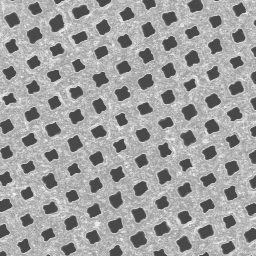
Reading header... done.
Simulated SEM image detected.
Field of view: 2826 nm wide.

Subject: a regular array of holes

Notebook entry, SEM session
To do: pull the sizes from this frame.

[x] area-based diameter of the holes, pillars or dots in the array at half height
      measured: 139 nanometers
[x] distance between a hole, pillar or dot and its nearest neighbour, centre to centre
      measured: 25.5 pixels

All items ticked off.